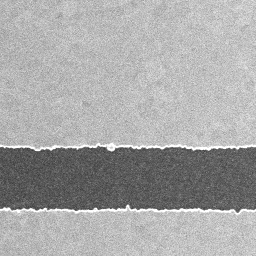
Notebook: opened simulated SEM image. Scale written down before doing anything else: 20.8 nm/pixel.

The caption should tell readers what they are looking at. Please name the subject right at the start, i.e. one or a few lines or trenches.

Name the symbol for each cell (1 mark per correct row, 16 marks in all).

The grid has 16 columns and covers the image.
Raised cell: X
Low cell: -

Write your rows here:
XXXXXXXXXXXXXXXX
XXXXXXXXXXXXXXXX
XXXXXXXXXXXXXXXX
XXXXXXXXXXXXXXXX
XXXXXXXXXXXXXXXX
XXXXXXXXXXXXXXXX
XXXXXXXXXXXXXXXX
XXXXXXXXXXXXXXXX
XXXXXXXXXXXXXXXX
----------------
----------------
----------------
----------------
XXXXXXXXXXXXXXXX
XXXXXXXXXXXXXXXX
XXXXXXXXXXXXXXXX